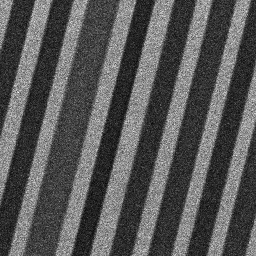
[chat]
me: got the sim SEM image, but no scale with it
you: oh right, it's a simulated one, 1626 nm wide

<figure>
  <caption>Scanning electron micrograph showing parallel lines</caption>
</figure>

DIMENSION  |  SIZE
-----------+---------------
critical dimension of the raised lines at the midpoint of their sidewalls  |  104 nanometers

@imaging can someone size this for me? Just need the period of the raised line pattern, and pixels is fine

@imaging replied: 38.6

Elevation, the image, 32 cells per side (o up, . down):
oo..oo...oo....oo..ooo..oo...oo.
o...oo...oo....oo..ooo..oo...oo.
o...oo...o....oo...oo...oo...oo.
o..ooo..oo....oo..ooo...oo...oo.
o..oo...oo....oo..ooo..oo...oo..
...oo...oo....oo..ooo..oo...oo..
...oo...o....oo...oo...oo...oo..
..ooo..oo....oo..ooo...oo...oo..
..oo...oo....oo..ooo..oo...oo...
..oo...oo....oo..oo...oo...oo..o
..oo..oo....oo...oo...oo...oo..o
.ooo..oo....oo..ooo...oo...oo..o
.oo...oo....oo..ooo..oo...oo...o
.oo...oo....oo..oo...oo...oo..oo
.oo..oo....oo...oo...oo...oo..oo
ooo..oo....oo..ooo...oo...o...oo
oo...oo....oo..ooo..oo...oo...oo
oo...oo....oo..oo...oo...oo..oo.
oo..oo....oo...oo...oo...oo..oo.
oo..oo....oo..ooo...oo...oo..oo.
o...oo....oo..ooo..oo...oo...oo.
o...oo....oo..oo...oo...oo..oo..
o..oo....oo...oo...oo...oo..oo..
o..oo....oo..ooo...oo...oo..oo..
...oo....oo..ooo..oo...oo...oo..
...oo....oo..oo...oo...oo..oo...
..oo....oo...oo...oo...oo..oo...
..oo....oo..ooo...oo...oo..oo...
..oo....oo..ooo..oo...oo...oo...
..oo....oo..oo...oo...oo..oo...o
.oo....oo...oo...oo...oo..oo...o
.oo....oo..ooo..ooo...o...oo...o